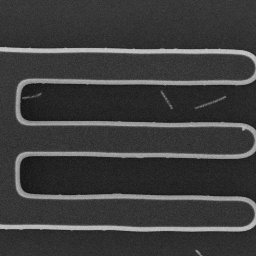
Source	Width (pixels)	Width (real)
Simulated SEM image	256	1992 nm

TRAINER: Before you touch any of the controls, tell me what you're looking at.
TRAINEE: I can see groups of lines, slits or small figures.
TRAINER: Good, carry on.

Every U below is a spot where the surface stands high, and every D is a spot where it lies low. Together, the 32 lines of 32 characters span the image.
DDDDDDDDDDDDDDDDDDDDDDDDDDDDDDDD
DDDDDDDDDDDDDDDDDDDDDDDDDDDDDDDD
DDDDDDDDDDDDDDDDDDDDDDDDDDDDDDDD
DDDDDDDDDDDDDDDDDDDDDDDDDDDDDDDD
DDDDDDDDDDDDDDDDDDDDDDDDDDDDDDDD
DDDDDDDDDDDDDDDDDDDDDDDDDDDDDDDD
UUUUUUUUUUUUUUUUUUUUUUUUUUUUUDDD
UUUUUUUUUUUUUUUUUUUUUUUUUUUUUUUU
UUUUUUUUUUUUUUUUUUUUUUUUUUUUUUUU
UUUUUUUUUUUUUUUUUUUUUUUUUUUUUUUU
UUUDDDDDDDDDDDDDDDDDDDDDDDDDDDDD
UUDDDDDDDDDDDDDDDDDDDDDDDDDDDDDD
UUDDDDDDDDDDDDDDDDDDDDDDDDDDDDDD
UUDDDDDDDDDDDDDDDDDDDDDDDDDDDDDD
UUDDDDDDDDDDDDDDDDDDDDDDDDDDDDDD
UUUUUUUUUUUUUUUUUDDDDDDDDDDDDDDD
UUUUUUUUUUUUUUUUUUUUUUUUUUUUUUUU
UUUUUUUUUUUUUUUUUUUUUUUUUUUUUUUU
UUUUUUUUUUUUUUUUUUUUUUUUUUUUUUUU
UUUDDDDDDDDDDDDDDDDDDDDUUUUUUUUD
UUDDDDDDDDDDDDDDDDDDDDDDDDDDDDDD
UUDDDDDDDDDDDDDDDDDDDDDDDDDDDDDD
UUDDDDDDDDDDDDDDDDDDDDDDDDDDDDDD
UUDDDDDDDDDDDDDDDDDDDDDDDDDDDDDD
UUUUDDDDDDDDDDDDDDDDDDDDDDDDDDDD
UUUUUUUUUUUUUUUUUUUUUUUUUUUUUUUU
UUUUUUUUUUUUUUUUUUUUUUUUUUUUUUUU
UUUUUUUUUUUUUUUUUUUUUUUUUUUUUUUU
DDDDDDDDDDDDDDDUUUUUUUUUUUUUUUUD
DDDDDDDDDDDDDDDDDDDDDDDDDDDDDDDD
DDDDDDDDDDDDDDDDDDDDDDDDDDDDDDDD
DDDDDDDDDDDDDDDDDDDDDDDDDDDDDDDD